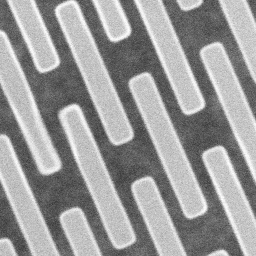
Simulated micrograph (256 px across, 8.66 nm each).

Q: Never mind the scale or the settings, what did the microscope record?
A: groups of lines, slits or small figures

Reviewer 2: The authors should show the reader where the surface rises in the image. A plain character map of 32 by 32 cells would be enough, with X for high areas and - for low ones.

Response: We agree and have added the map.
-XXX----X---XXX--XXX--XXX---XXX-
--XXX--XXX--XXX---XXX-------XXX-
--XXX--XXX---XXX--XXX-------XXXX
---XXX--XXX--XXX--XXXX-------XXX
X--XXX--XXX---XX---XXX-------XXX
X---XX---XXX-------XXX----X---XX
XX--XXX--XXX--------XXX--XXX--XX
XX--XXX--XXXX-------XXX--XXXX--X
XXX--X----XXX--------XXX--XXX--X
XXX-------XXXX---XX--XXX--XXX---
XXX--------XXX--XXX--XXX---XXX--
-XXX-------XXX---XXX--XXX--XXX--
-XXX--------XXX--XXX--XXX---XXX-
--XX-----X--XXX--XXXX--XX---XXX-
--XXX---XX--XXXX--XXX-------XXXX
---XX---XXX--XXX--XXX--------XXX
---XX---XXX--XXXX--XXX-------XXX
X---XX---XXX--XX---XXX--------XX
X---XX---XXX--------XXX----X--XX
XX---XX--XXXX-------XXX--XXX---X
XX---XX---XXX-------XXXX--XXX--X
XXX-------XXX--------XXX--XXX---
XXX--------XXX---XX--XXX---XXX--
-XXX-------XXX---XXX--XXX--XXX--
-XXX--------XXX--XXX--XXX---XXX-
-XXXX-------XXX--XXX---XXX--XXX-
--XXX---XX--XXXX--XXX--XX---XXX-
--XXX---XXX--XXX--XXX--------XXX
---XXX--XXX--XXX---XXX-------XXX
---XXX--XXXX--XXX--XXX--------XX
X---XXX--XXX--XX---XXXX-------XX
XX--XXX--XXX--------XXX----X--XX